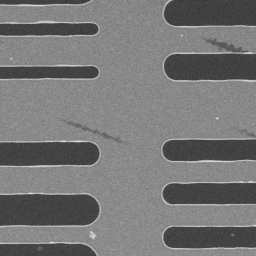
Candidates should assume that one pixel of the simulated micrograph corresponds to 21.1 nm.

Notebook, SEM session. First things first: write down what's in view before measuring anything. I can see groups of lines, slits or small figures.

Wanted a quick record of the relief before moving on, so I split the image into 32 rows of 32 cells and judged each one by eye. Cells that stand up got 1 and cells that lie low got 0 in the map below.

00000000001111111111100000000000
11111111111111111111100000000000
11111111111111111111100000000000
00000000000011111111111111111111
00000000011111111111111111111111
11111111111111111111111111111111
11111111111111111111111111111111
11111111111111111111100000000000
00000000000011111111100000000000
00000000000011111111100000000000
11111111111111111111111111111111
11111111111111111111111111111111
11111111111111111111111111111111
11111111111111111111111111111111
11111111111111111111111111111111
11111111111111111111111111111111
11111111111111111111111111111111
11111111111111111111110000000000
00000000000011111111000000000000
00000000000011111111100000000000
00000000000011111111111111111111
11111111111111111111111111111111
11111111111111111111111111111111
11111111111111111111100000000000
00000000000111111111000000000000
00000000000011111111110000000000
00000000000011111111111111111111
00000000000011111111111111111111
11111111111111111111100000000000
11111111111111111111000000000000
00000000001111111111100000000000
00000000000011111111111111111111